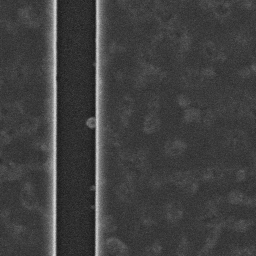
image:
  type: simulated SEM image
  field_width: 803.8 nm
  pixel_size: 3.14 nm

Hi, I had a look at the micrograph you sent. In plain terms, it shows one or a few lines or trenches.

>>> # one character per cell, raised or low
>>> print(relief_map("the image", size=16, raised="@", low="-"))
@@@---@@@@@@@@@@
@@@---@@@@@@@@@@
@@@---@@@@@@@@@@
@@@---@@@@@@@@@@
@@@---@@@@@@@@@@
@@@---@@@@@@@@@@
@@@---@@@@@@@@@@
@@@---@@@@@@@@@@
@@@---@@@@@@@@@@
@@@---@@@@@@@@@@
@@@---@@@@@@@@@@
@@@---@@@@@@@@@@
@@@---@@@@@@@@@@
@@@---@@@@@@@@@@
@@@---@@@@@@@@@@
@@@---@@@@@@@@@@